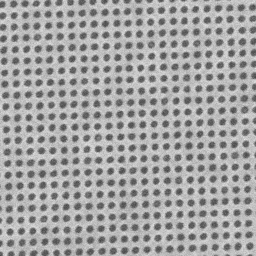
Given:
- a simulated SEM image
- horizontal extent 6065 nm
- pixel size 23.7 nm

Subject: a regular array of holes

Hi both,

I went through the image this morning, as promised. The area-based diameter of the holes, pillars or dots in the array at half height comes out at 0.181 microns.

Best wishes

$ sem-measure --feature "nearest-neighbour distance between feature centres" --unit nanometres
262